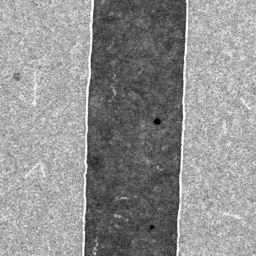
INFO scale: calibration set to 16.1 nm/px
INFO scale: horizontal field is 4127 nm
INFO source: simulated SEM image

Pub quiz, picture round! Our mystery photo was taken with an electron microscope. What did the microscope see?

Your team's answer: one or a few lines or trenches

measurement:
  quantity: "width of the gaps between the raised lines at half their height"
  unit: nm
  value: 1530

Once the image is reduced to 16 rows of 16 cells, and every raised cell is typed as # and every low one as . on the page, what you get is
######......####
######......####
######......####
######......####
######......####
######......####
#####......#####
#####......#####
#####......#####
#####......#####
#####......#####
#####......#####
#####......#####
#####......#####
#####......#####
#####......#####